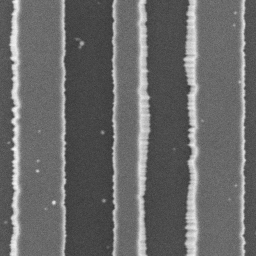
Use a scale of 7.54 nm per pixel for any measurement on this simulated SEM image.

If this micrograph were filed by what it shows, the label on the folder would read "lines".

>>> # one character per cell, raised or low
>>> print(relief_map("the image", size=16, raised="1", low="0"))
0111000110001110
0111000110001110
0111000110001110
0111000110001110
0111000110001110
0111000110001110
0111000110001110
0111000110001110
0111000110001110
0111000110001110
0111000110001110
0111000110001110
0111000110001110
0111000110001110
0111000110001110
0111000110001110